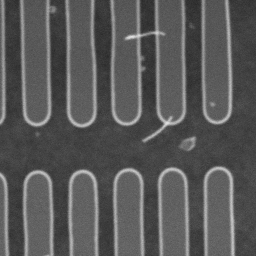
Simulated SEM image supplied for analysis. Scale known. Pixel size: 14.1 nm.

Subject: groups of lines, slits or small figures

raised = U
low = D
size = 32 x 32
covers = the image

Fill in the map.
DDDUUUDDUUUUDDUUUDDDUUUDDUUUDDDD
DDDUUUDDUUUUDDUUUDDDUUUDDUUUDDDD
DDDUUUDDUUUUDDUUUDDDUUUDDUUUDDDD
DDDUUUDDUUUDDDUUUDDDUUUDDUUUUDDD
DDDUUUDDDUUUDDUUUDDDUUUDDUUUUDDD
DDDUUUDDDUUUDDUUUDDDUUUDDUUUUDDD
DDDUUUDDDUUUDDUUUDDDUUUDDUUUUDDD
DDDUUUDDDUUUDDUUUDDDUUUDDUUUUDDD
DDDUUUDDDUUUDDUUUDDDUUUDDUUUUDDD
DDDUUUDDDUUUDDUUUDDDUUUDDUUUUDDD
DDDUUUDDDUUUDDUUUDDDUUUDDUUUUDDD
DDDUUUDDDUUUDDUUUDDDUUUDDUUUUDDD
DDDUUUDDDUUUDDUUUDDDUUUDDDUUUDDD
DDDUUUDDDUUUDDUUUDDDUUUDDDUUUDDD
DDDUUUDDDUUUDDUUUDDDUUUDDDUUDDDD
DDDDUDDDDUUDDDDDDDDDDDDDDDDDDDDD
DDDDDDDDDDDDDDDDDDDDDDDDDDDDDDDD
DDDDDDDDDDDDDDDDDDDDDDDDDDDDDDDD
DDDDDDDDDDDDDDDDDDDDDDDDDDDDDDDD
DDDDDDDDDDDDDDDDDDDDDDDDDDDDDDDD
DDDDDDDDDDDDDDDDDDDDDDDDDDDDDDDD
DDDDDDDDDDDDDDDUUDDDDUUDDDUUDDDD
UDDUUUDDDUUUDDUUUUDDUUUDDDUUUDDD
UDDUUUDDDUUUDDUUUUDDUUUDDDUUUDDD
UDDUUUDDDUUUDDUUUUDDUUUDDDUUUDDD
UDDUUUDDDUUUDDUUUUDDUUUDDDUUUDDD
UDDUUUDDDUUUDDUUUUDDUUUDDDUUUDDD
UDDUUUDDDUUUDDUUUUDDUUUDDDUUUDDD
UDDUUUDDDUUUDDUUUUDDUUUDDDUUUDDD
UDDUUUDDDUUUDDUUUUDDUUUDDDUUUDDD
UDDUUUDDDUUUDDUUUUDDUUUDDDUUUDDD
UDDUUUDDDUUUDDDUUUDDUUUDDDUUUDDD